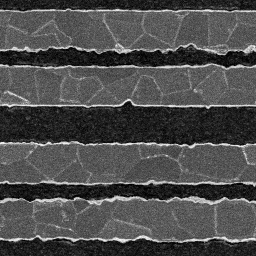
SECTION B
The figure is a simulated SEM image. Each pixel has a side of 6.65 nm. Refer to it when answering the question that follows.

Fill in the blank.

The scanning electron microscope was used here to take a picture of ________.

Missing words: one or a few lines or trenches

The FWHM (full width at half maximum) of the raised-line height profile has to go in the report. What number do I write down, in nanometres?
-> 265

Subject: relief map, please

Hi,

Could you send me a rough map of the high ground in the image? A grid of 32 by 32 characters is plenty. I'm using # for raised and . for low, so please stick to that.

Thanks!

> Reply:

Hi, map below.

................................
################################
################################
################################
################################
################################
............#..#...........##...
................................
############################.###
################################
################################
################################
################################
................................
................................
................................
................................
................................
################################
################################
################################
################################
################################
................................
................................
################################
################################
################################
################################
################################
................................
................................